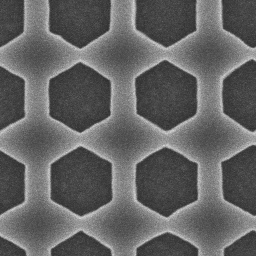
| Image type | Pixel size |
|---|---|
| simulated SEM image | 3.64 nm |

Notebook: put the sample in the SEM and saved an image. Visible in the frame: holes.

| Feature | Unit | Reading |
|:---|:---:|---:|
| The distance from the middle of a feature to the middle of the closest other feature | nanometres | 307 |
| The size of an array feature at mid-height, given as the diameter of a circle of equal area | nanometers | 237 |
